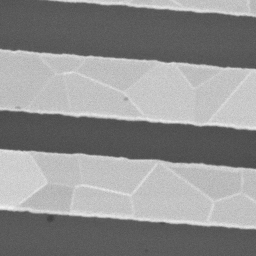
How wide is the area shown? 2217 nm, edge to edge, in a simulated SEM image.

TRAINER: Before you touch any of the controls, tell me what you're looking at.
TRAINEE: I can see lines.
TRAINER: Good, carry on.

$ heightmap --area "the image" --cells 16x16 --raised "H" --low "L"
LLLLLLLLLLHHHHHH
LLLLLLLLLLLLLLLL
LLLLLLLLLLLLLLLL
HHHHHLLLLLLLLLLL
HHHHHHHHHHHHHHHH
HHHHHHHHHHHHHHHH
HHHHHHHHHHHHHHHH
LLLLLLLLHHHHHHHH
LLLLLLLLLLLLLLLL
HHLLLLLLLLLLLLLL
HHHHHHHHHHHHHHHL
HHHHHHHHHHHHHHHH
HHHHHHHHHHHHHHHH
LLLLLHHHHHHHHHHH
LLLLLLLLLLLLLLLL
LLLLLLLLLLLLLLLL